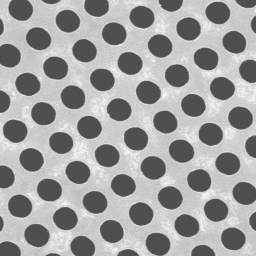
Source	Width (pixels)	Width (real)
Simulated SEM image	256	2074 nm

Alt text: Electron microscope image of a regular array of holes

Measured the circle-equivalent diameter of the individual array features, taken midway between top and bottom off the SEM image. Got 193 nanometres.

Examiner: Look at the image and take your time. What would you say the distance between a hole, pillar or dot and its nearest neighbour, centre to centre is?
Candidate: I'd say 33.1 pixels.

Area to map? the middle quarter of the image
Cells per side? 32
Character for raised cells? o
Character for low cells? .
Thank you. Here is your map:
.oooooooooooo.......oooooo....oo
.ooooooo...ooo.....ooooooo.....o
.oooooo.....oooo..ooooooo......o
oooooo.......oooooooooooo......o
ooooooo......ooooooo..oooo.....o
o..oooo.....oooooo.....oooo...oo
.....ooo...ooooooo......oooooooo
.....ooooooooooooo......oooooooo
.....ooooooooooooo......oooooo..
.....oooooo.....ooo....oooooo...
.....oooooo......oooooooooooo...
ooooooooooo......ooooooooooooo..
ooooooooooo......oooooo....ooo..
oooo....oooo....oooooo......oooo
ooo......ooooooooooooo......oooo
ooo......oooooooooooooo.....oooo
ooo.......oooooo....ooo.....oooo
.ooo.....oooooo......ooooooooooo
..ooo...ooooooo......ooooooooooo
..ooooooooooooo......oooooo....o
..ooooooo...oooo.....ooooo......
..oooooo.....oooo...oooooo......
oooooooo......oooooooooooo......
oooooooo......oooooo....ooo.....
oo..oooo.....oooooo......ooo...o
o.....ooo...ooooooo......ooooooo
......ooooooooooooo......ooooooo
.......ooooooo.ooooo.....oooooo.
o.....oooooo.....oooo...ooooooo.
oo....oooooo......ooooooooooooo.
oooooooooooo......ooooooooooooo.
oooooooooooo......oooooo.....ooo